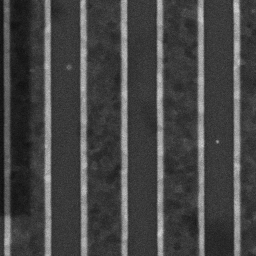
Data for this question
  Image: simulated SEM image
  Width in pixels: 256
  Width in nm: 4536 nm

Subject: wiring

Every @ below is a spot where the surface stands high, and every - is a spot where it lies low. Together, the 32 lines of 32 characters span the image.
-@@@@@----@@@@@@----@@@@@-----@@
-@@@@@----@@@@@@----@@@@@-----@@
-@@@@@----@@@@@@----@@@@@-----@@
-@@@@@----@@@@@@----@@@@@-----@@
-@@@@@----@@@@@@----@@@@@-----@@
-@@@@@----@@@@@@----@@@@@-----@@
-@@@@@----@@@@@@----@@@@@-----@@
-@@@@@----@@@@@@----@@@@@-----@@
-@@@@@----@@@@@@----@@@@@-----@@
-@@@@@----@@@@@@----@@@@@-----@@
-@@@@@----@@@@@@----@@@@@-----@@
-@@@@@----@@@@@@----@@@@@-----@@
-@@@@@----@@@@@@----@@@@@-----@@
-@@@@@----@@@@@@----@@@@@-----@@
-@@@@@----@@@@@@----@@@@@-----@@
-@@@@@----@@@@@@----@@@@@-----@@
-@@@@@----@@@@@@----@@@@@-----@@
-@@@@@----@@@@@@----@@@@@-----@@
-@@@@@----@@@@@@----@@@@@-----@@
-@@@@@----@@@@@@----@@@@@-----@@
-@@@@@----@@@@@@----@@@@@-----@@
-@@@@@----@@@@@@----@@@@@-----@@
-@@@@@----@@@@@@----@@@@@-----@@
-@@@@@----@@@@@@----@@@@@-----@@
-@@@@@----@@@@@@----@@@@@-----@@
-@@@@@----@@@@@@----@@@@@-----@@
-@@@@@----@@@@@@----@@@@@-----@@
-@@@@@----@@@@@@----@@@@@-----@@
-@@@@@----@@@@@@----@@@@@-----@@
-@@@@@----@@@@@@----@@@@@-----@@
-@@@@@----@@@@@@----@@@@@-----@@
-@@@@@----@@@@@@----@@@@@-----@@